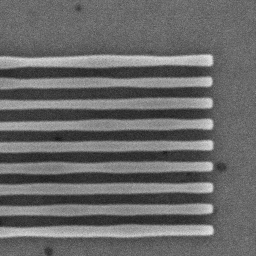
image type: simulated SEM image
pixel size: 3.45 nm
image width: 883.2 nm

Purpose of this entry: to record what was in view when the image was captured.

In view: groups of lines, slits or small figures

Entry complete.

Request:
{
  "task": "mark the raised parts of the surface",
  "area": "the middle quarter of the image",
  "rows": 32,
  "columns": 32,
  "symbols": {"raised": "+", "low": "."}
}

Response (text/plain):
+++++++++++++++.................
................................
................................
................................
++++++++++++++++++++++++++++++++
++++++++++++++++++++++++++++++++
................................
................................
................................
++++++++++++++++++++++++++++++++
++++++++++++++++++++++++++++++++
................................
................................
................................
...+++++++++++++++++++++++++++++
++++++++++++++++++++++++++++++++
...+++++++++++..................
................................
................................
...+++++++++++++++++++++++++++++
++++++++++++++++++++++++++++++++
++++++++++++++++................
................................
................................
.....................++++.......
++++++++++++++++++++++++++++++++
++++++++++++++++++++++++++++++++
................................
................................
................................
++++++++++++++++++++++++++++++++
++++++++++++++++++++++++++++++++